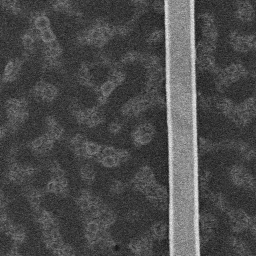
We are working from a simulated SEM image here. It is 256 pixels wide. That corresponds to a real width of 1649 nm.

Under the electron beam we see one or a few lines or trenches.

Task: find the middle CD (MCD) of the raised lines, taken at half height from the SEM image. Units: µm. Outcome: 0.167